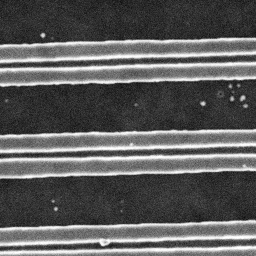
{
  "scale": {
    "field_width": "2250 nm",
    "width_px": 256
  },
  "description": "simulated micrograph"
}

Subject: lines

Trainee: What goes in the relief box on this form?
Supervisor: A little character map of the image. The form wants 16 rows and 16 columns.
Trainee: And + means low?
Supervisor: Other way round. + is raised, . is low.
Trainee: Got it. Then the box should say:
................
................
............++++
++++++++++++++++
++++++++++++++++
................
................
................
++++++++++++++++
++++++++++++++++
++++++++++++++++
................
................
................
++++++++++++++++
++++++++++++++++